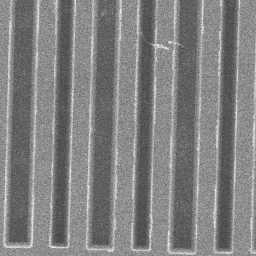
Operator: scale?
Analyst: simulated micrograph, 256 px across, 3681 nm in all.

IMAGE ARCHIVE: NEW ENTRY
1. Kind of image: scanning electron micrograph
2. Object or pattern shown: parallel lines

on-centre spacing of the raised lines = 0.587 microns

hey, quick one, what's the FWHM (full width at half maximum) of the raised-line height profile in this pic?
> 336 nm